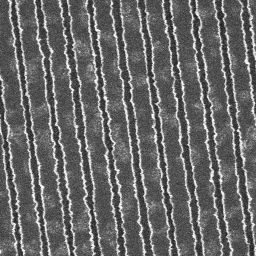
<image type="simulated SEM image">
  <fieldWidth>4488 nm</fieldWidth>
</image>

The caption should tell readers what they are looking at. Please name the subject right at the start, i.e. parallel lines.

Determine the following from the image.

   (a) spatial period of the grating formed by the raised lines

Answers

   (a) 0.447 microns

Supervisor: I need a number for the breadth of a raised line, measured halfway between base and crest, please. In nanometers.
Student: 335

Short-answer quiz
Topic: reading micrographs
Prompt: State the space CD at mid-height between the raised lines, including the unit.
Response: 115 nm